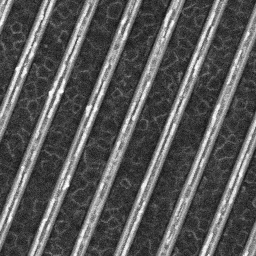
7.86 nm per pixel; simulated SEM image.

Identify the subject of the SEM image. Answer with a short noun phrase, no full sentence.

parallel lines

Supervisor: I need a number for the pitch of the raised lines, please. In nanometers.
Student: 313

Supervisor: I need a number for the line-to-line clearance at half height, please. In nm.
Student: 236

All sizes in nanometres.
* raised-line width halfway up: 75.8